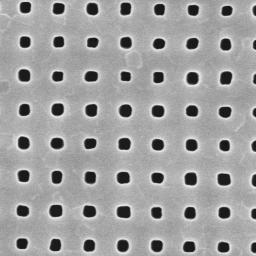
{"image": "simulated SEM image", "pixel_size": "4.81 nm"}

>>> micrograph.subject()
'a regular array of holes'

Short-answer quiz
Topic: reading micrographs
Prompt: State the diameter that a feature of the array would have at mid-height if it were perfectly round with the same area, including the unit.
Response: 58.2 nm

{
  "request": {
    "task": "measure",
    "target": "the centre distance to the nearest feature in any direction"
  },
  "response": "159 nanometers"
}